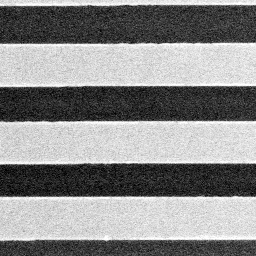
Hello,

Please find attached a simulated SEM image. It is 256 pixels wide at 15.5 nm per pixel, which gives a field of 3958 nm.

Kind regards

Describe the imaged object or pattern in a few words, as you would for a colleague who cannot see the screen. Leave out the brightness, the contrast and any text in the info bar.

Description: lines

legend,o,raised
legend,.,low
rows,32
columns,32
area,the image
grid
oooooooooooooooooooooooooooooooo
................................
................................
................................
................................
...............o.ooooooooooooooo
oooooooooooooooooooooooooooooooo
oooooooooooooooooooooooooooooooo
oooooooooooooooooooooooooooooooo
oooooooooooooooooooooooooooooooo
oooooooooooooooooooooooooooooooo
................................
................................
................................
................................
oooooooooooooooooooooooooooooooo
oooooooooooooooooooooooooooooooo
oooooooooooooooooooooooooooooooo
oooooooooooooooooooooooooooooooo
oooooooooooooooooooooooooooooooo
................................
................................
................................
................................
................................
oooooooooooooooooooooooooooooooo
oooooooooooooooooooooooooooooooo
oooooooooooooooooooooooooooooooo
oooooooooooooooooooooooooooooooo
oooooooooooooooooooooooooooooooo
................................
................................